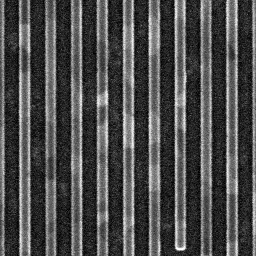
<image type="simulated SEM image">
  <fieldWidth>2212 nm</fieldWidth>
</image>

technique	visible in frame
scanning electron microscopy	parallel lines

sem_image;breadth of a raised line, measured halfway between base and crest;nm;84.2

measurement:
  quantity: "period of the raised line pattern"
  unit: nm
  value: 224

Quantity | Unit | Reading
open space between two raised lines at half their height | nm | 146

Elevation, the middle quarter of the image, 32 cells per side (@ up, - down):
--@@-----@@----@@----@@@----@@--
--@@-----@@----@@----@@@----@@--
--@@-----@@----@@----@@@----@@--
--@@-----@@----@@----@@@----@@--
--@@-----@@----@@----@@@----@@--
--@@-----@@----@@----@@@----@@--
--@@-----@@----@@----@@@----@@--
--@@-----@@----@@----@@@----@@--
--@@-----@@----@@----@@@----@@--
--@@-----@@----@@----@@@----@@--
--@@-----@@----@@----@@@----@@--
--@@-----@@----@@----@@@----@@--
--@@-----@@----@@----@@@----@@--
--@@-----@@----@@----@@@----@@--
--@@-----@@----@@----@@@----@@--
--@@-----@@----@@----@@@----@@--
--@@-----@@----@@----@@@----@@--
--@@-----@@----@@----@@@----@@--
--@@-----@@----@@----@@@----@@--
--@@-----@@----@@----@@@----@@--
--@@-----@@----@@----@@@----@@--
--@@-----@@----@@----@@@----@@--
--@@-----@@----@@----@@@----@@--
--@@-----@@----@@----@@@----@@--
--@@-----@@----@@----@@@----@@--
--@@-----@@----@@----@@@----@@--
--@@-----@@----@@----@@@----@@--
--@@-----@@----@@----@@@----@@--
--@@-----@@----@@----@@@----@@--
--@@-----@@----@@----@@@----@@--
--@@-----@@----@@----@@@----@@--
--@@-----@@----@@----@@@----@@--